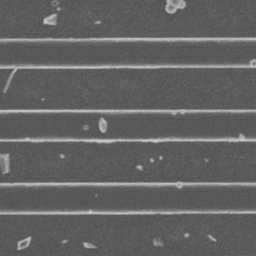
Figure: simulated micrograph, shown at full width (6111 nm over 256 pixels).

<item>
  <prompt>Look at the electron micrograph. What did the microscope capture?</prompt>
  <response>lines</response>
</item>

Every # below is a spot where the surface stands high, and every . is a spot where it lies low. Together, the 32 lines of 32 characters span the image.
.....................##.........
................................
......#.........................
................................
................................
################################
################################
################################
................................
................................
................................
................................
................................
................................
################################
################################
################################
######.#############............
................................
................................
................................
................................
................................
################################
################################
################################
################################
................................
................................
................................
................................
................................